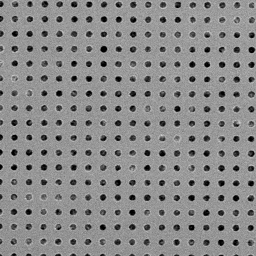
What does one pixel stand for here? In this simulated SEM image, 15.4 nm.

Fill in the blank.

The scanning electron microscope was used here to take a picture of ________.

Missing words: a regular array of holes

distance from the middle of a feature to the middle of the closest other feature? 224 nanometers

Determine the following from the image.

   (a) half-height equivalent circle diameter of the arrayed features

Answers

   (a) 105 nm